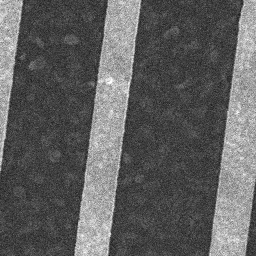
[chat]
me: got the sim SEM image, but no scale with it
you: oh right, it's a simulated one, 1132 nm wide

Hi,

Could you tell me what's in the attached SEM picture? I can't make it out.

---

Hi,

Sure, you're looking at one or a few lines or trenches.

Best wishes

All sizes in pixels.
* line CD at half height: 32.3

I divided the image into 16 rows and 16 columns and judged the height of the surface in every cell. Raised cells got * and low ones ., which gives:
*......**......*
*......**......*
*.....**.......*
*.....**.......*
*.....**.......*
*.....**......**
*.....**......**
......**......**
......**......**
......**......**
.....**.......**
.....**.......**
.....**.......**
.....**......***
.....**......***
.....**......**.